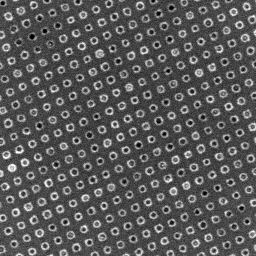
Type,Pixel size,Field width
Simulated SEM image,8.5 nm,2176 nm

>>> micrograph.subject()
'a regular array of raised bodies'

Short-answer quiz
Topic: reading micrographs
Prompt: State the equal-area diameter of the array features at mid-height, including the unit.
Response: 57.5 nm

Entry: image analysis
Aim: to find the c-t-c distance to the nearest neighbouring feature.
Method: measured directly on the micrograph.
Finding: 0.117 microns